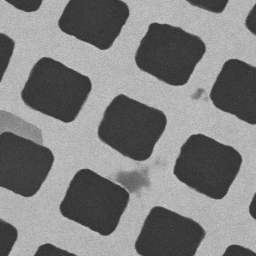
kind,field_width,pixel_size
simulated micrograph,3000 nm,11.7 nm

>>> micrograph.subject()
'holes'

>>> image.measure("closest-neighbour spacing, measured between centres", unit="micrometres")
0.978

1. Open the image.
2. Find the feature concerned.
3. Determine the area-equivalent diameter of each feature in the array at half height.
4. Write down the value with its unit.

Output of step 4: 730 nanometers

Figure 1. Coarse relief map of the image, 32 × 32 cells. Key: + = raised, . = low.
+....+++........++++++++....++++
++++++++........++++++++++..+++.
+++++++.........+++++++++++++++.
++++++++.......++++...+++++++++.
.++++++++......+++.......+++++++
..+++++++++...+++.........++++++
..+++++++++++++++.........++++++
.++++..++++++++++........++++.++
.+++.....++++++++.......++++....
++++.......++++++++.....+++.....
+++........++++++++++..++++.....
+++........+++++++++++++++......
+++........+++...+++++++++......
++++......+++......++++++++.....
++++++....+++........++++++++...
+++++++++++++........+++++++++++
++++++++++++........++++++++++++
....+++++++++.......+++....+++++
......++++++++.....++++......+++
.......+++++++++...+++........++
.......+++++++++++++++........++
......++++..++++++++++........++
......+++.....++++++++.......+++
+....+++.......+++++++++.....+++
+++.++++........++++++++++..++++
++++++++........+++++++++++++++.
++++++++.......++++...+++++++++.
+++++++++......+++......++++++++
..+++++++++...++++.......+++++++
..+++++++++++++++.........++++++
..+++++++++++++++........+++++++
.++++....++++++++........+++....